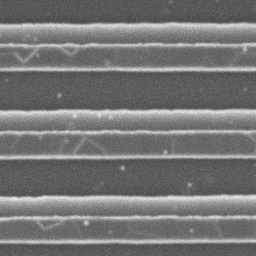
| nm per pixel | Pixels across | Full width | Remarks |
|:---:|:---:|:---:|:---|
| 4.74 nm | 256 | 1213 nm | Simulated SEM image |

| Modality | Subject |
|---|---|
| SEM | lines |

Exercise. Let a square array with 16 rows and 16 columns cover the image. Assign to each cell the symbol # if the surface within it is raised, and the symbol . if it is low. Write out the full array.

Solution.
................
..........##...#
################
################
................
................
................
################
################
################
................
................
################
################
################
................